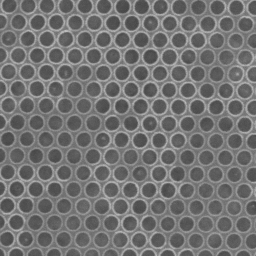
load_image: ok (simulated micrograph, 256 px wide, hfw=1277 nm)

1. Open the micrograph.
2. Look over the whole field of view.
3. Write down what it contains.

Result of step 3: a regular array of holes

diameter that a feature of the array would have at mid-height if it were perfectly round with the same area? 74 nm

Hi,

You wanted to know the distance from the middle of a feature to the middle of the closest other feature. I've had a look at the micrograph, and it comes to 93.3 nanometres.